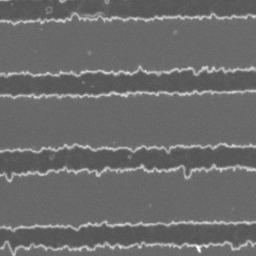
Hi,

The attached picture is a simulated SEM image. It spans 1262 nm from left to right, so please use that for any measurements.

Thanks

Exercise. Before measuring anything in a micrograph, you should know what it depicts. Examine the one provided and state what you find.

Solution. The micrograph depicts one or a few lines or trenches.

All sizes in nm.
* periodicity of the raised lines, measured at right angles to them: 376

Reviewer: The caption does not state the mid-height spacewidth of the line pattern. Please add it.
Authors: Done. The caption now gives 262 nm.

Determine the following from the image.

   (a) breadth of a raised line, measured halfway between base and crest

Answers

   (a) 113 nanometers